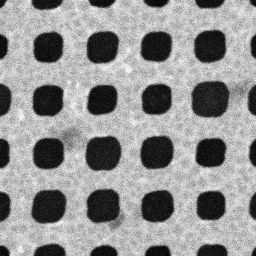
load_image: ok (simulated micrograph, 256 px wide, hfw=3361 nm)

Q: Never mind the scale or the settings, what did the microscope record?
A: a regular array of holes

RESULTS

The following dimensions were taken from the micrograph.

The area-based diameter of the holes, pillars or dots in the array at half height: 33.2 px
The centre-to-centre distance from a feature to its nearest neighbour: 0.694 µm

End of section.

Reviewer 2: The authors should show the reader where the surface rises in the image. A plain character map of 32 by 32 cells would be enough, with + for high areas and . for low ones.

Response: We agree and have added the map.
.+++....+++...++++...++++...+++.
++++++++++++++++++++++++++++++++
++++++++++++++++++++++++++++++++
++++++++++++++++++++++++++++++++
.++++...+++....+++...++++...++++
.+++....+++....+++....++....+++.
.+++....+++....+++...+++....+++.
+++++..++++...++++...++++..+++++
++++++++++++++++++++++++++++++++
++++++++++++++++++++++++++++++++
++++++++++++++++++++.++++...++++
.+++....+++....+++...+++.....++.
.+++....+++....+++...+++.....++.
.+++....+++...++++...+++....+++.
+++++..++++++++++++++++++...++++
++++++++++++++++++++++++++++++++
++++++++++++++++++++++++++++++++
.++++..++++....+++...++++...++++
.+++....+++....+++....+++...+++.
.+++....+++....+++....++....+++.
.+++....+++....+++...++++...++++
++++++++++++++++++++++++++++++++
++++++++++++++++++++++++++++++++
++++++++++++++++++++++++++++++++
.+++....+++....+++....+++...++++
.+++....+++....+++....+++...+++.
.+++....+++....+++....+++...+++.
.+++...++++...++++...+++++.+++++
++++++++++++++++++++++++++++++++
++++++++++++++++++++++++++++++++
++++++++++++++++++++++++++.+++++
.+++....+++....+++...++++...+++.